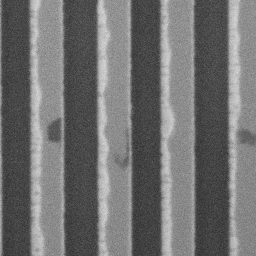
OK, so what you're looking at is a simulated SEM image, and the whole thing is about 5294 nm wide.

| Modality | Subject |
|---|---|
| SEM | lines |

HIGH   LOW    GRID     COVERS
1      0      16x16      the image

0011001100110001
0011001100110001
0011001100110001
0011001100110001
0011001100110001
0011001100110001
0011001100110001
0011001100110001
0011001100110001
0011001100110001
0011001100110001
0011001100110001
0011001100110001
0011001100110001
0011001100110001
0011001100110001